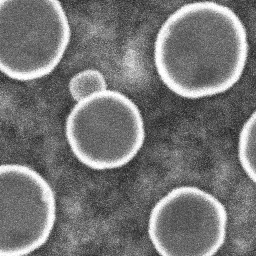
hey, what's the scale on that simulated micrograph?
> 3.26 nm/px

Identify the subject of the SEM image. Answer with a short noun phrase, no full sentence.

raised bodies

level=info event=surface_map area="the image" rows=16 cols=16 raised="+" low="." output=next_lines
++++........++..
++++......+++++.
++++......+++++.
++++......+++++.
+++.......+++++.
...........+++..
.....+++........
....+++++.......
....+++++......+
.....+++.......+
+..............+
+++.............
+++.......+++...
+++.......++++..
+++......+++++..
++........++++..